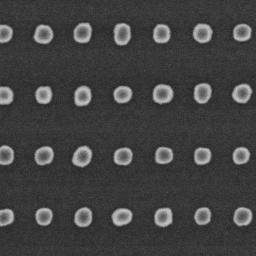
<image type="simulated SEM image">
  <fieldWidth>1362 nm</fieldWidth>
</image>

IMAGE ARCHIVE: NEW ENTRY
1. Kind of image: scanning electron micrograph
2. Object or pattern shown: a regular array of raised bodies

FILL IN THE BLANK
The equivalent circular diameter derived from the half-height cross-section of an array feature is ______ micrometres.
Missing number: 0.0942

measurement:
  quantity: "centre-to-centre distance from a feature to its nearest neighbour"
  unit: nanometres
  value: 210